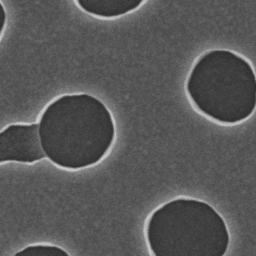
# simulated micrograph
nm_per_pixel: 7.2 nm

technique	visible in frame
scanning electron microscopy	holes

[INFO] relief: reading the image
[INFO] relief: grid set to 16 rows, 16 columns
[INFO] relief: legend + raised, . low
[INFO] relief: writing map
+++++...++++++++
++++++++++++++++
++++++++++++++++
+++++++++++++..+
++++++++++++....
++++++++++++....
+++...++++++....
++.....++++++..+
.......+++++++++
.......+++++++++
++++.+++++++++++
++++++++++++++++
+++++++++++.++++
+++++++++.....++
+++++++++.....++
++..+++++.....++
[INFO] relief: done